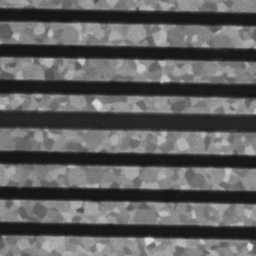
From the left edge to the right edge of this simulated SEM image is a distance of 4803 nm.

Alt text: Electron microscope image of parallel lines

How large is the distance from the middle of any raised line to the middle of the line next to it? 0.668 microns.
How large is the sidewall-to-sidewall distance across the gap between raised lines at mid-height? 220 nanometres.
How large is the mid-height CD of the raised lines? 0.457 microns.